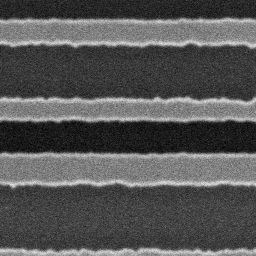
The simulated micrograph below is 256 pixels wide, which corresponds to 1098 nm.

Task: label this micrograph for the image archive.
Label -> lines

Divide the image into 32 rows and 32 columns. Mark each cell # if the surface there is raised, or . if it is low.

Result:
................................
................................
...#..#........#......####..####
################################
################################
.####.#..##############.########
................................
................................
................................
................................
................................
................................
########.##.######.#.###..##....
################################
################################
................................
................................
................................
................................
################################
################################
################################
################################
................................
................................
................................
................................
................................
................................
................................
................................
#####.#.#################..#####